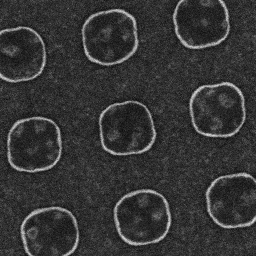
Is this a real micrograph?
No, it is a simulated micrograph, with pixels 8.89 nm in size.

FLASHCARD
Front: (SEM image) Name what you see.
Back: raised bodies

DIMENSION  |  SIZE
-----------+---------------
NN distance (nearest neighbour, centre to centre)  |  824 nm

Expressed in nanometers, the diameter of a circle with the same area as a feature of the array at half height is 490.